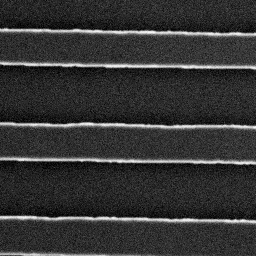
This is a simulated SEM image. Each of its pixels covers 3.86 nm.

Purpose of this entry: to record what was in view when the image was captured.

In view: lines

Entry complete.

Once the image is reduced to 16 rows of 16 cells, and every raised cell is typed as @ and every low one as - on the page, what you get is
----------------
----------------
@@@@@@@@@@@@@@@@
@@@@@@@@@@@@@@@@
----------------
----------------
----------------
----------------
@@@@@@@@@@@@@@@@
@@@@@@@@@@@@@@@@
----------------
----------------
----------------
----------------
@@@@@@@@@@@@@@@@
@@@@@@@@@@@@@@@@